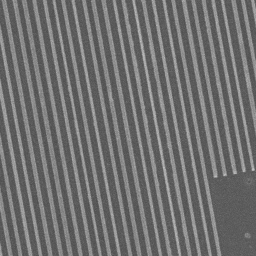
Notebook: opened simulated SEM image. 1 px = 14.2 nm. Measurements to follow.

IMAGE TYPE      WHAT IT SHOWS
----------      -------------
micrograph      parallel lines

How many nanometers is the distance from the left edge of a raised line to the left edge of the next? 139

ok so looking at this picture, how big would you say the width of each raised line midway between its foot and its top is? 3.44 pixels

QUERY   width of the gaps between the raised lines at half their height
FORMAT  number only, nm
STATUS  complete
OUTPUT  96.1